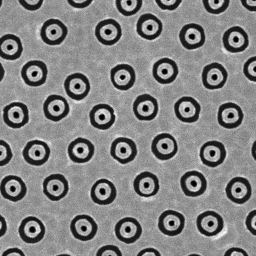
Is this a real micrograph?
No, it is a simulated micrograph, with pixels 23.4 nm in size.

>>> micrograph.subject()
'a regular array of ring-shaped grooves with a dot in the middle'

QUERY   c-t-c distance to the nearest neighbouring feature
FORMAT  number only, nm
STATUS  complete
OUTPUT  946